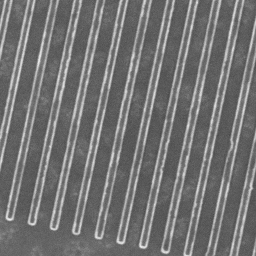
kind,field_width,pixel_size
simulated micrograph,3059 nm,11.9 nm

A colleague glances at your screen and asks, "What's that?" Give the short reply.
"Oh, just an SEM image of parallel lines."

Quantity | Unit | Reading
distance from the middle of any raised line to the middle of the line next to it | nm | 271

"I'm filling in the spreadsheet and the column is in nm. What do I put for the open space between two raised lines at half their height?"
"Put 183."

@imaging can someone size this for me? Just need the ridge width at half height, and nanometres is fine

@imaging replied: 80.5